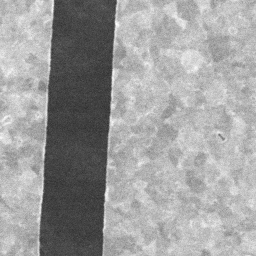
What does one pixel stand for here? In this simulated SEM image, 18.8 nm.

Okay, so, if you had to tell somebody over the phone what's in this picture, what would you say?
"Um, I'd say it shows one or a few lines or trenches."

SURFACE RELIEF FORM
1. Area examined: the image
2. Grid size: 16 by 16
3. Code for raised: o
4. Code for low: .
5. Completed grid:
ooo....ooooooooo
ooo....ooooooooo
ooo....ooooooooo
ooo....ooooooooo
ooo....ooooooooo
ooo....ooooooooo
ooo....ooooooooo
ooo....ooooooooo
ooo....ooooooooo
ooo....ooooooooo
ooo....ooooooooo
ooo....ooooooooo
ooo....ooooooooo
oo.....ooooooooo
oo....oooooooooo
oo....oooooooooo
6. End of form